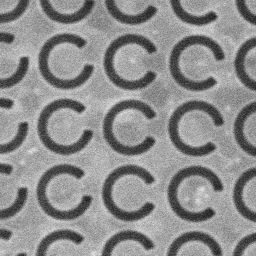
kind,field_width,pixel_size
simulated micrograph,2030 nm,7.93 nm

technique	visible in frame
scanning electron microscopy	an array of small figures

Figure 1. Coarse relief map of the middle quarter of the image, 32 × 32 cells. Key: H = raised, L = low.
HHHHHLLLHHLLLHHHHHHHHHHHHHLLLHHH
HHHHLLLLHHLLLHHHHHHHHHHHHHLLLHHH
HHHHLLLHHHLLLLHHHHHHLLLHHHHLLLHH
HHLLLLLHHHHLLLLHHHHLLLLHHHHLLLLH
LLLLLLHHHHHHLLLLLLLLLLHHHHHHLLLL
LLLLHHHHHHHHHLLLLLLLLHHHHHHHHLLL
LLHHHHHHHHHHHHLLLLLHHHHHHHHHHHLL
HHHHHHHHHHHHHHHHHHHHHHHHHHHHHHHH
LHHHHHHHHHHHHHHHHHHHHHHHHHHHHHHH
LLLLHHHHHHHHHLLLLLLLHHHHHHHHHHLL
LLLLLHHHHHHHLLLLLLLLLLHHHHHHLLLL
HHLLLHHHHHHLLLLLLLLLLLLHHHHLLLLL
HHHLHHHHHHLLLLHHHHHLLLLHHHHLLLLH
HHHHHHHHHHLLLHHHHHHHLLLHHHLLLLHH
HHHHHHHHHHLLLHHHHHHHHHHHHHLLLHHH
HHHHHHHHHLLLHHHHHHHHHHHHHHLLLHHH
HHHHHLLHHLLLHHHHHHHHHHHHHHLLLHHH
HHHHLLLHHLLLLHHHHHHHHHHHHHLLLHHH
HHHHLLLHHHLLLHHHHHHHLLLHHHLLLHHH
HHHLLLLHHHLLLLHHHHHLLLLHHHHLLLHH
LLLLLLHHHHHLLLLLLLLLLLHHHHHLLLLL
LLLLLHHHHHHHLLLLLLLLLHHHHHHHLLLL
LLLHHHHHHHHHHHLLLLLLHHHHHHHHHLLL
HHHHHHHHHHHHHHHHHHHHHHHHHHHHHHHH
HHHHHHHHHHHHHHHHHHHHHHHHHHHHHHHH
LLLHHHHHHHHHHHLLLLLLHHHHHHHHHHHL
LLLLLHHHHHHHLLLLLLLLLHHHHHHHHLLL
LLLLLHHHHHHLLLLLLLLLLLHHHHHLLLLL
HHHLHHHHHHLLLLHHHHLLLLLHHHHLLLLH
HHHHHHHHHHLLLHHHHHHHLLLHHHLLLLHH
HHHHHHHHHLLLHHHHHHHHHHHHHHLLLHHH
HHHHHHHHHLLLHHHHHHHHHHHHHHLLLHHH